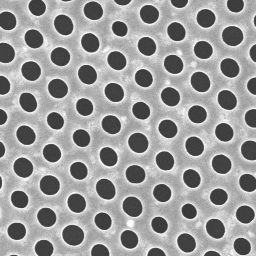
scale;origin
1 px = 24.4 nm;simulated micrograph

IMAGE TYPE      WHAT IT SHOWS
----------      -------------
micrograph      a regular array of holes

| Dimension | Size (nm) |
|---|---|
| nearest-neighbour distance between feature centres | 778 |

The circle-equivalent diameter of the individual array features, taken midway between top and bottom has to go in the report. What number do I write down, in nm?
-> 471